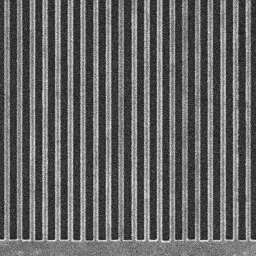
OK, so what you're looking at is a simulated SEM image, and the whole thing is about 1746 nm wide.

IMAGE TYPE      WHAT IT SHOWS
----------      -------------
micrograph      parallel lines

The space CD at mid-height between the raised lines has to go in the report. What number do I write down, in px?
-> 8.37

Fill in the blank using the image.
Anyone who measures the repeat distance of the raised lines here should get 0.0864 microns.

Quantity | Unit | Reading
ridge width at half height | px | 4.25